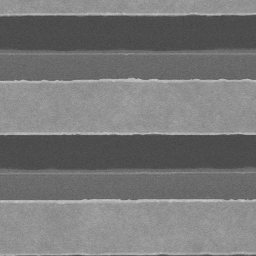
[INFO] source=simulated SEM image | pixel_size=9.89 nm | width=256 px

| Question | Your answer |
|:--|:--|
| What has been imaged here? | lines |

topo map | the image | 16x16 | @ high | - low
@@@@@@@@@@@@@@@@
----------------
----------------
@@@@@@@@@@@@@@@@
@@@@@@@@@@@@@@@@
@@@@@@@@@@@@@@@@
@@@@@@@@@@@@@@@@
@@@@@@@@@@@@@@@@
----------------
----------------
----------------
@@@@@@@@@@@@@@@@
@@@@@@@@@@@@@@@@
@@@@@@@@@@@@@@@@
@@@@@@@@@@@@@@@@
@@@@@@@@@@@@@@@@